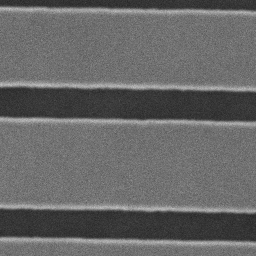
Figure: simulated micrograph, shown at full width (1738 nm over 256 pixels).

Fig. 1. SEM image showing lines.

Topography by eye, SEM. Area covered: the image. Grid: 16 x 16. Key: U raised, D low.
UUUDDDDDDDDDDDDD
UUUUUUUUUUUUUUUU
UUUUUUUUUUUUUUUU
UUUUUUUUUUUUUUUU
UUUUUUUUUUUUUUUU
DDDDDDDDUUUUUUUU
DDDDDDDDDDDDDDDD
UUUUUUUUUUDDDDDD
UUUUUUUUUUUUUUUU
UUUUUUUUUUUUUUUU
UUUUUUUUUUUUUUUU
UUUUUUUUUUUUUUUU
UUUUUUUUUUUUUUUU
DDDDDDDDDDDDDDDD
DDDDDDDDDDDDDDDD
UUUUUUUUUUUUUUUU